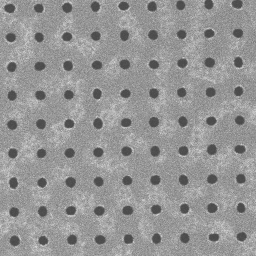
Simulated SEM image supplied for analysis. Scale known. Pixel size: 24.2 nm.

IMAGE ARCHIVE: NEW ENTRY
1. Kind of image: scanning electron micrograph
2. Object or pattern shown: a regular array of holes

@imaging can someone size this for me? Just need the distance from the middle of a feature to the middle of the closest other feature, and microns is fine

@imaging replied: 0.683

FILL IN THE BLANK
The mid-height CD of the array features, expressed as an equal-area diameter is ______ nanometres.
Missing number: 248